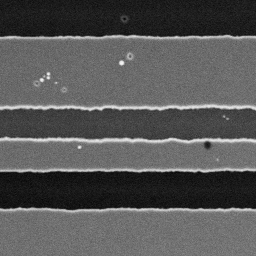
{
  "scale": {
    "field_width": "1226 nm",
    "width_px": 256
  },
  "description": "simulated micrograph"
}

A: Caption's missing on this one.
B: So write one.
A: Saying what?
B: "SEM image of lines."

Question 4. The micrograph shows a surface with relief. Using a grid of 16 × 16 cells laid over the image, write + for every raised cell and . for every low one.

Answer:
................
................
++++++++++++++++
++++++++++++++++
++++++++++++++++
++++++++++++++++
++++++++++++++++
++++++++++++++++
++++++++++++++++
++++++++++++++++
++++++++++++++++
................
................
++++++++++++++++
++++++++++++++++
++++++++++++++++